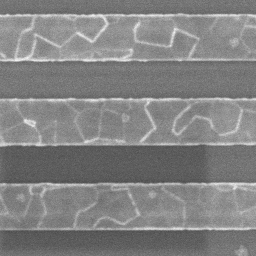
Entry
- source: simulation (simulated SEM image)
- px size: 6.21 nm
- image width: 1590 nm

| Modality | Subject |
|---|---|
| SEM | lines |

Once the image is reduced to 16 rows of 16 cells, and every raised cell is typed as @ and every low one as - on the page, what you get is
----------------
@@@@@@@@@@@@@@@@
@@@@@@@@@@@@@@@@
@@@@@@@@@@@@@@@@
----------------
----------------
@@@@@@@@@@@@@@@@
@@@@@@@@@@@@@@@@
@@@@@@@@@@@@@@@@
----------------
----------------
@-@@--@@@@@@@@@@
@@@@@@@@@@@@@@@@
@@@@@@@@@@@@@@@@
----------------
----------------